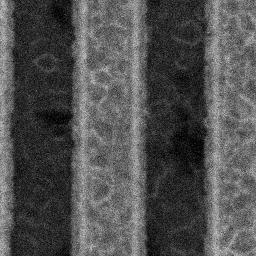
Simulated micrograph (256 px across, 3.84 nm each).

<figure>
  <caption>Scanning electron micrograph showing one or a few lines or trenches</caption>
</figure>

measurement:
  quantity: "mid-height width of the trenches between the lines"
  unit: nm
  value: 310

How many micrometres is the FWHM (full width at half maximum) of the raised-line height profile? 0.199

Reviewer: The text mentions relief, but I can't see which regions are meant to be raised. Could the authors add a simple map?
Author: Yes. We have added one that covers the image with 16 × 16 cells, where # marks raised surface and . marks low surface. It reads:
.....###......##
.....###......##
.....###......##
.....###......##
.....###......##
.....###.....###
.....###.....###
.....###.....###
.....###......##
.....###......##
.....###.....###
.....###.....###
.....###......##
.....###.....###
.....###.....###
.....###......##